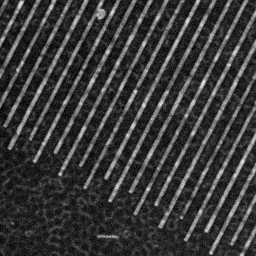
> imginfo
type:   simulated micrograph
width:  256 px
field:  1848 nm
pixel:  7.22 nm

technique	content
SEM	parallel lines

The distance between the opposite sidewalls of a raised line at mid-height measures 16.1 nm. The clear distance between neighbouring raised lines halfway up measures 84.9 nanometres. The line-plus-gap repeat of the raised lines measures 102 nanometres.